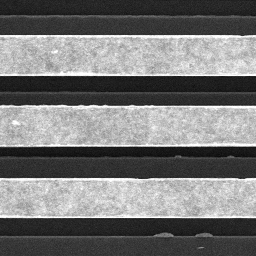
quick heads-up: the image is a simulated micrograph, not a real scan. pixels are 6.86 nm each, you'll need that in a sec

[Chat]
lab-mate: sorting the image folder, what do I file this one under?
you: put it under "lines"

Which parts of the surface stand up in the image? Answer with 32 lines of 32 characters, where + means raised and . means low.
................................
................................
................................
................................
++++++++++++++++++++++++++++++++
++++++++++++++++++++++++++++++++
++++++++++++++++++++++++++++++++
++++++++++++++++++++++++++++++++
++++++++++++++++++++++++++++++++
................................
................................
................................
................................
++++++++++++++++++++++++++++++++
++++++++++++++++++++++++++++++++
++++++++++++++++++++++++++++++++
++++++++++++++++++++++++++++++++
++++++++++++++++++++++++++++++++
................................
................................
................................
................................
++++++++++++++++++++++++++++++++
++++++++++++++++++++++++++++++++
++++++++++++++++++++++++++++++++
++++++++++++++++++++++++++++++++
++++++++++++++++++++++++++++++++
................................
................................
................................
................................
................................